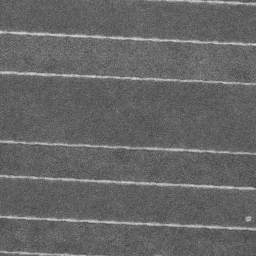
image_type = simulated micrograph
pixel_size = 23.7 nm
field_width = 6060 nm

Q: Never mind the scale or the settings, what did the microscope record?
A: lines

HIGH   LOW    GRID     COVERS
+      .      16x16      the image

++++++++++++++++
++++++++++++++++
.........+++++++
................
+...............
++++++++++++++++
++++++++++++++++
++++++++++++++++
++++++++++++++++
.............+++
................
+++++++++++.....
++++++++++++++++
++++++++++++++++
................
................